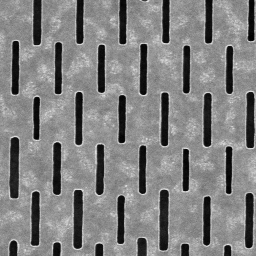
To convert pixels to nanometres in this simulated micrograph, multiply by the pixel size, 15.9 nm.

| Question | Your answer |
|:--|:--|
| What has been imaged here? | a regular array of holes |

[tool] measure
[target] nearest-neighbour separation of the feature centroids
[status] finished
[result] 677 nm